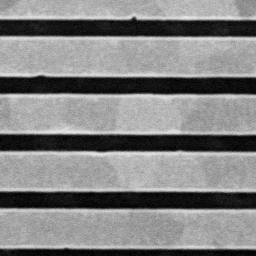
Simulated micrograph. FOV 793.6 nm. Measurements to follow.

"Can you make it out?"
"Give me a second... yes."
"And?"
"parallel lines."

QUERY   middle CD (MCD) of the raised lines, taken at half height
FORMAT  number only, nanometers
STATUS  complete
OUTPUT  116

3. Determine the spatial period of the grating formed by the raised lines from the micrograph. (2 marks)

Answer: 178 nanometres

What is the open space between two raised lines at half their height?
63.2 nanometres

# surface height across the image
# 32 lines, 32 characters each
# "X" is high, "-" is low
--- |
XXXXXXXXXXXXXXXXXXXXXXXXXXXXXXXX
XXXXXXXXXXXXXXXXXXXXXXXXXXXXXXXX
--------------------------------
--------------------------------
--------------------------------
XXXXXXXXXXXXXXXXXXXXXXXXXXXXXXXX
XXXXXXXXXXXXXXXXXXXXXXXXXXXXXXXX
XXXXXXXXXXXXXXXXXXXXXXXXXXXXXXXX
XXXXXXXXXXXXXXXXXXXXXXXXXXXXXXXX
----------------------XXX-------
--------------------------------
--------------------------------
XXXXXXXXXXXXXXXXXXXXXXXXXXXXXXXX
XXXXXXXXXXXXXXXXXXXXXXXXXXXXXXXX
XXXXXXXXXXXXXXXXXXXXXXXXXXXXXXXX
XXXXXXXXXXXXXXXXXXXXXXXXXXXXXXXX
XXXXXXXXXXXXXXXXXXXXXXXXXXXXXXXX
--------------------------------
--------------------------------
XXXXXXXXXXXXXXXXXXXXXXXXXXXXXXXX
XXXXXXXXXXXXXXXXXXXXXXXXXXXXXXXX
XXXXXXXXXXXXXXXXXXXXXXXXXXXXXXXX
XXXXXXXXXXXXXXXXXXXXXXXXXXXXXXXX
XXXXXXXXXXXXXXXXXXXXXXXXXXXXXXXX
--------------------------------
--------------------------------
XXXXXXXXXXXXXXXXXXXXXXXXXXXXXXXX
XXXXXXXXXXXXXXXXXXXXXXXXXXXXXXXX
XXXXXXXXXXXXXXXXXXXXXXXXXXXXXXXX
XXXXXXXXXXXXXXXXXXXXXXXXXXXXXXXX
XXXXXXXXXXXXXXXXXXXXXXXXXXXXXXXX
--------------------------------